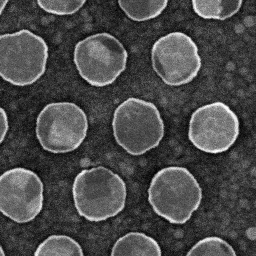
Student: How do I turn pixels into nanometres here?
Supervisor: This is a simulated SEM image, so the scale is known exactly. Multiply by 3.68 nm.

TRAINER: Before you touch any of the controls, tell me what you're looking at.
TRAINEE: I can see raised bodies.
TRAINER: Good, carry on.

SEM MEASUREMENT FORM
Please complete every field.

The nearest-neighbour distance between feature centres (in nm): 279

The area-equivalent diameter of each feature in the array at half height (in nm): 189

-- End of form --